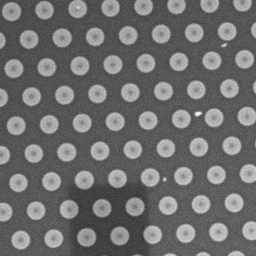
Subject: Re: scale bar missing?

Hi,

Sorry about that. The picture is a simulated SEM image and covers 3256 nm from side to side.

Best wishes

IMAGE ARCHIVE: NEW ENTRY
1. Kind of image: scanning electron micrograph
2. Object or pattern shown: an array of small figures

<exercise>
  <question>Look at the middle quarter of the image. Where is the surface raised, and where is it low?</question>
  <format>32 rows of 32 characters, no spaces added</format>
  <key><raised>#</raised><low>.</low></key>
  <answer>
..####....####....#####....####.
..####....####.....###......##..
...##...........................
................................
................................
........#......###.....####....#
##....####.....####....####....#
##....####.....####....####....#
##.....###.....###......##......
##......#.......................
................................
................................
............##......##......###.
...###.....####....####....####.
..#####....####....####....####.
..#####....####....####.....###.
...###......#...................
................................
................................
................##......###.....
##.....####....####....####.....
###....####....####....#####....
###....####....####.....###.....
##.....###.......#..............
................................
................................
....................###.....###.
....###.....###.....####....####
...####....#####...#####....####
...####....####.....###.....###.
...####.....###......#..........
................................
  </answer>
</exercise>